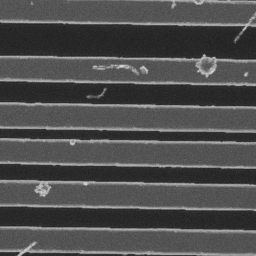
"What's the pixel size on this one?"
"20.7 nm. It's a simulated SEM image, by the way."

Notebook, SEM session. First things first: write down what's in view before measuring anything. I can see lines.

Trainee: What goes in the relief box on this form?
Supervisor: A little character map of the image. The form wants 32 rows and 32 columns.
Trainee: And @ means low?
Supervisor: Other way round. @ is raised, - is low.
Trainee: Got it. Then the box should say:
@@@@@@@@@@@@@@@@@@@@@@@@@@@@@@@@
@@@@@@@@@@@@@@@@@@@@@@@@@@@@@@@@
@@@@@@@@@@@@@@@@@@@@@@@@@@@@@@@@
--------------------------------
--------------------------------
--------------------------------
--------------------------------
@@@@@@@@@@@@@@@@@@@@@@@@@@@@----
@@@@@@@@@@@@@@@@@@@@@@@@@@@@@@@@
@@@@@@@@@@@@@@@@@@@@@@@@@@@@@@@@
--------------------------@@@@@@
--------------------------------
--------------------------------
@@@@@@@@@@@@@@@@@@@@@@@@@@@@@@@@
@@@@@@@@@@@@@@@@@@@@@@@@@@@@@@@@
@@@@@@@@@@@@@@@@@@@@@@@@@@@@@@@@
-------------------------------@
@@@@@@@@@@----------------------
@@@@@@@@@@@@@@@@@@@@@@@@@@@@@@@@
@@@@@@@@@@@@@@@@@@@@@@@@@@@@@@@@
----@@@@@@@@@@@@@@@@@@@@@@@@@@@@
--------------------------------
--------------------------------
@@@@@@@@@@@@@@@@@@@@@@@@@@@@@@@@
@@@@@@@@@@@@@@@@@@@@@@@@@@@@@@@@
@@@@@@@@@@@@@@@@@@@@@@@@@@@@@@@@
--------------------------------
--------------------------------
@@@@----------------------------
@@@@@@@@@@@@@@@@@@@@@@@@@@@@@@@@
@@@@@@@@@@@@@@@@@@@@@@@@@@@@@@@@
--@@---@@@@@@@@@@@@@@@@@@@@@@@@@